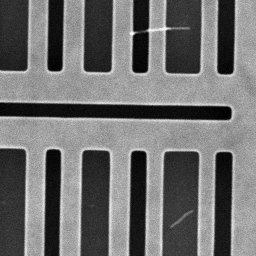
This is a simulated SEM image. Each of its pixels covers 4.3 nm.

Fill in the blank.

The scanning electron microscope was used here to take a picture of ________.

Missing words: groups of lines, slits or small figures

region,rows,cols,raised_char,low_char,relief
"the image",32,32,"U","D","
DDDDUUDDUUUDDDUUUDDUUDDDDUUDDUUU
DDDDUUDDUUDDDDUUUDDUUDDDDUUDDUUU
DDDDUUDDUUDDDDUUUDDUUDDDDUUDDUUU
DDDDUUDDUUDDDDUUUDDUUDDDDUUDDUUU
DDDDUUDDUUDDDDUUUDDUUDDDDUUDDUUU
DDDDUUDDUUDDDDUUUDDUUDDDDUUDDUUU
DDDDUUDDUUDDDDUUDDDUUDDDDUUDDUUU
DDDDUUDDUUDDDDUUDDDUUDDDDUUDDUUU
DDDUUUDDUUUDDDUUUDUUUDDDDUUDDUUU
UUUUUUUUUUUUUUUUUUUUUUUUUUUUUUUU
UUUUUUUUUUUUUUUUUUUUUUUUUUUUUUUU
UUUUUUUUUUUUUUUUUUUUUUUUUUUUUUUU
UUUUUUUUUUUUUUUUUUUUUUUUUUUUUUUU
DDDDDDDDDDDDDDDDDDDDDDDDDDDDDUUU
DDDDDDDDDDDDDDDDDDDDDDDDDDDDDUUU
UUUUUUUUUUUUUUUUUUUUUUUUUUUUUUUU
UUUUUUUUUUUUUUUUUUUUUUUUUUUUUUUU
UUUUUUUUUUUUUUUUUUUUUUUUUUUUUUUU
DDUUUUUUUUUUUUUUUUUUUUUUUUUUUUUU
DDDUUUDDUUDDDDUUDDUUUDDDDUUDDUUU
DDDUUUDDUUDDDDUUDDUUDDDDDUUDDUUU
DDDUUUDDUUDDDDUUDDUUDDDDDUUDDUUU
DDDUUUDDUUDDDDUUDDUUDDDDDUUDDUUU
DDDUUUDDUUDDDDUUDDUUDDDDDUUDDUUU
DDDUUUDDUUDDDDUUDDUUDDDDDUUDDUUU
DDDUUDDDUUDDDDUUDDUUDDDDDUUDDUUU
DDDUUDDDUUDDDDUUDDUUDDDDDUUDDUUU
DDDUUDDDUUDDDDUUDDUUDDDDDUUDDUUU
DDDUUDDDUUDDDDUUDDUUDDDDDUUDDUUU
DDDUUDDDUUDDDDUUDDUUDDDDDUUDDUUU
DDDUUDDDUUDDDDUUDDUUDDDDDUUDDUUU
DDDUUDDDUUDDDDUUDDUUDDDDDUUDDUUU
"